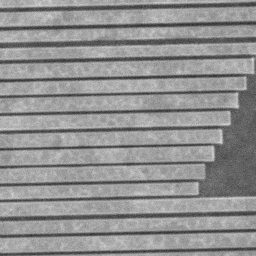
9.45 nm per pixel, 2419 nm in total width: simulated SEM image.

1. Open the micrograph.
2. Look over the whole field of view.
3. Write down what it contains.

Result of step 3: parallel lines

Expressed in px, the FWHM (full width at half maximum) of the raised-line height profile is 12.9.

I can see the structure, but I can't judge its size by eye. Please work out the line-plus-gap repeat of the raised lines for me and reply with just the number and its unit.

0.164 microns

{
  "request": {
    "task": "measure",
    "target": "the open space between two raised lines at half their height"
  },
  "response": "43.7 nm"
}